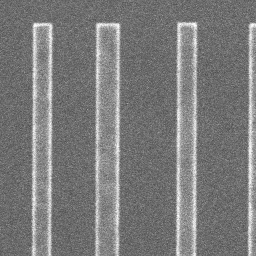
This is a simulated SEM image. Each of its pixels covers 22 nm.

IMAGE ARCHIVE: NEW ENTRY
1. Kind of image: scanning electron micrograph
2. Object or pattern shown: one or a few lines or trenches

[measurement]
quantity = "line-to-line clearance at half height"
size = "1.2 microns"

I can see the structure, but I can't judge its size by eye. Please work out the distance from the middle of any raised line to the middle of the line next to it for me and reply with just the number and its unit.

1590 nanometres